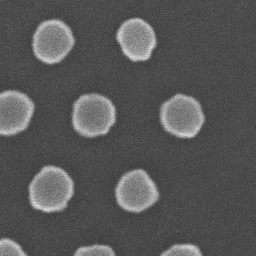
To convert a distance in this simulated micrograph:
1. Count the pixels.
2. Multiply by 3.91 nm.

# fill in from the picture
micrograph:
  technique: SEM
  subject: raised bodies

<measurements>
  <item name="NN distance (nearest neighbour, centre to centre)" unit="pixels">84.5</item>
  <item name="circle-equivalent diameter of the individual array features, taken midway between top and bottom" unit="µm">0.154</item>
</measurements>